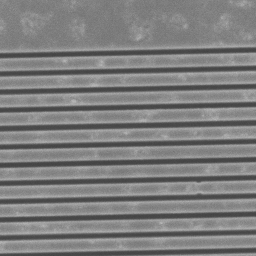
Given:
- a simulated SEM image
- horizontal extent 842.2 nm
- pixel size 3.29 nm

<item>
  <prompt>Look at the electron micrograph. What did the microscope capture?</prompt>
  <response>parallel lines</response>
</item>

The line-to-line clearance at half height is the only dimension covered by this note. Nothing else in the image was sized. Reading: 19.7 nanometers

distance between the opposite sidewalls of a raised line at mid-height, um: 0.0427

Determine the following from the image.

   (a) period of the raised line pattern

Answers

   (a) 59.9 nm